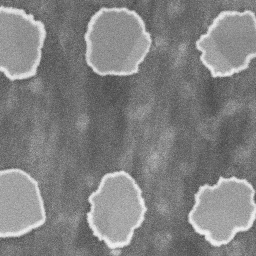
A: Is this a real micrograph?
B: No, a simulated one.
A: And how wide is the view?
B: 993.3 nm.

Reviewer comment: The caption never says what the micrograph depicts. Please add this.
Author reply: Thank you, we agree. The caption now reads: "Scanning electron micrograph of raised bodies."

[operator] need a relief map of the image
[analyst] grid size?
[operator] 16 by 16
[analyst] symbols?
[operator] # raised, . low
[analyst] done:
................
##....###....###
###..####....###
##...####....###
##....##.....##.
................
................
................
................
................
................
##....##......#.
###...###...####
###...###...####
##....##.....##.
................